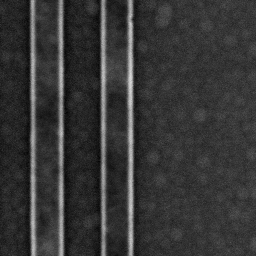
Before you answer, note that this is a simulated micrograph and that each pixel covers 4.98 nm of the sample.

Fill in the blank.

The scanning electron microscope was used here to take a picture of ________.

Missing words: one or a few lines or trenches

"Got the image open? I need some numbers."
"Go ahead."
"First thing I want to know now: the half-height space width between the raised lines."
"206 nm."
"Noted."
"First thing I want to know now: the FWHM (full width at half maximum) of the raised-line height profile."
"141 nanometres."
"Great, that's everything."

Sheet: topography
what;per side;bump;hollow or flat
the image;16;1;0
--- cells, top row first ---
0011001100000000
0011001100000000
0011001100000000
0011001100000000
0011001100000000
0011001100000000
0011001100000000
0011001100000000
0011001100000000
0011001100000000
0011001100000000
0011001100000000
0011001100000000
0011001100000000
0011001100000000
0011001100000000